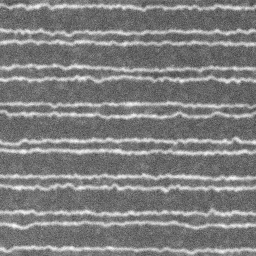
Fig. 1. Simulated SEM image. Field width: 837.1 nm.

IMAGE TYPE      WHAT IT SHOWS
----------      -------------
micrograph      parallel lines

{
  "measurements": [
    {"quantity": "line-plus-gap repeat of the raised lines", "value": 0.118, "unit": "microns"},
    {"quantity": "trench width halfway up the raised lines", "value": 80.2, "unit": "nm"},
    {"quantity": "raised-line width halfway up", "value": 38.4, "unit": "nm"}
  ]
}